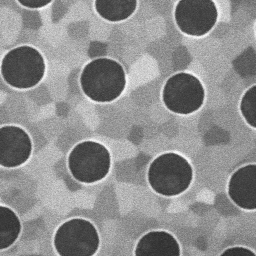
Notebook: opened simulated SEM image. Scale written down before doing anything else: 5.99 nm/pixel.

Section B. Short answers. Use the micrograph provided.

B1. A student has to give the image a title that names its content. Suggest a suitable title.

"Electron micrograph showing holes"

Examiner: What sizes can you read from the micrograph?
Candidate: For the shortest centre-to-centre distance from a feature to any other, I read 488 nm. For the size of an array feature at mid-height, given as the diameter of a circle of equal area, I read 260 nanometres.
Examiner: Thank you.